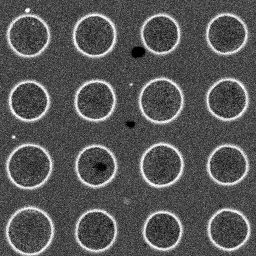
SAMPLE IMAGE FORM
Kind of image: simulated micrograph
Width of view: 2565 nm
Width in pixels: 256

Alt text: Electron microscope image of a regular array of holes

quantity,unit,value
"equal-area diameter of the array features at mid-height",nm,382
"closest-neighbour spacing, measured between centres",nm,651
